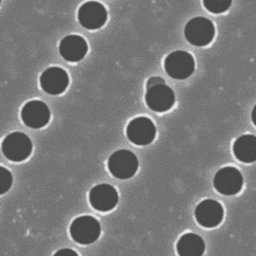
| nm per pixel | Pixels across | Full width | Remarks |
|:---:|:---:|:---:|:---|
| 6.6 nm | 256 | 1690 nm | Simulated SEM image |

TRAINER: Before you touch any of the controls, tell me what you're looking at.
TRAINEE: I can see a regular array of holes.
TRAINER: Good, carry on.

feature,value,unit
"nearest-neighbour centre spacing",0.248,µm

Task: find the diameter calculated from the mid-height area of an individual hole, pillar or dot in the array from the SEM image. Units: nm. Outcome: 194